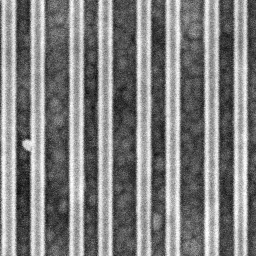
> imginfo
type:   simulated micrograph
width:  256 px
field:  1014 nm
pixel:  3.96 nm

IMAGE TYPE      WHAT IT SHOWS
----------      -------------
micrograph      parallel lines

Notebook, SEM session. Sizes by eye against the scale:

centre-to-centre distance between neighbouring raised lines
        131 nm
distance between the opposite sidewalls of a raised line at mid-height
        41.1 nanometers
